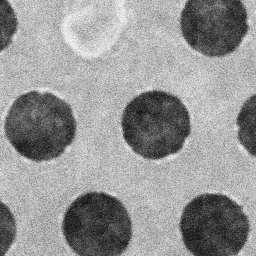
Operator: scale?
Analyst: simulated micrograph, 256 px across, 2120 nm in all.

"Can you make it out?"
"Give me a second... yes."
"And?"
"holes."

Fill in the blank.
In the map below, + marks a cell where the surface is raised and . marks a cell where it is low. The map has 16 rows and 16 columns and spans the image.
.++++++++++....+
.++++++++++....+
.+++++++++++...+
+++++++++++++.++
++++++++++++++++
++++++++++++++++
+...++++...++++.
.....+++....+++.
.....+++....+++.
+...++++...+++++
++++++++++++++++
++++++++++++++++
+++++..+++++...+
.+++....+++....+
.+++....+++.....
.+++....++++...+